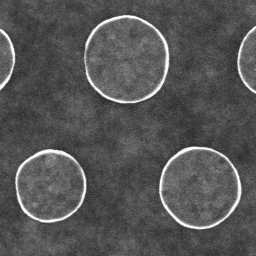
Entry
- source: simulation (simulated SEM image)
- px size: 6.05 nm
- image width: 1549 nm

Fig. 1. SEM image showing raised bodies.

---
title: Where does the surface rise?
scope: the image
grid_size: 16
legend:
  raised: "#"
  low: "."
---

................
......###.......
#.....####.....#
#....#####.....#
#....#####.....#
......####......
................
................
................
...#.......###..
.####.....#####.
.####.....#####.
.####.....#####.
..##.......###..
................
................